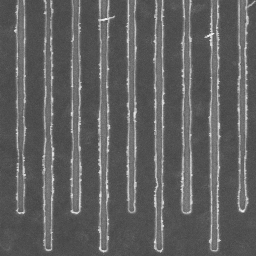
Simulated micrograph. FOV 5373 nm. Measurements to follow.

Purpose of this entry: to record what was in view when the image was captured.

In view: parallel lines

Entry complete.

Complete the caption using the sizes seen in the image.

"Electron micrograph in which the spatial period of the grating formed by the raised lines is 583 nm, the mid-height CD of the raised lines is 454 nanometres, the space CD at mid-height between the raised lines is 0.123 micrometres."